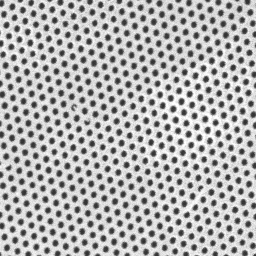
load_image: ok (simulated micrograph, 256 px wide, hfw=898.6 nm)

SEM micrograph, a regular array of holes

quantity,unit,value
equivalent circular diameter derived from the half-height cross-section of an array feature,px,6.58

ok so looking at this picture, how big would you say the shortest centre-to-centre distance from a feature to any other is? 38.1 nm